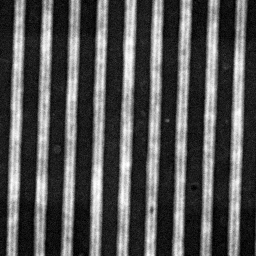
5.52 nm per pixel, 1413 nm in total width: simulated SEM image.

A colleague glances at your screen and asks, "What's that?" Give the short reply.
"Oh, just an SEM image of parallel lines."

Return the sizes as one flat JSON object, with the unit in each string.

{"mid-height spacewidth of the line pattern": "0.103 micrometres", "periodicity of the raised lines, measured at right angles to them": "0.153 microns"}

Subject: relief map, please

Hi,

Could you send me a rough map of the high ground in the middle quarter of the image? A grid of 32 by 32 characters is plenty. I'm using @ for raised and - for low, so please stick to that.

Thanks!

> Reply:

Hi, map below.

-@@-----@@-----@@-----@@-----@@-
-@@-----@@-----@@-----@@-----@@-
-@@-----@@-----@@-----@@-----@@-
-@@-----@@-----@@-----@@-----@@-
-@@-----@@-----@@-----@@-----@@-
-@@-----@@-----@@-----@@-----@@-
-@@-----@@-----@@-----@@-----@@-
-@@-----@@-----@@-----@@-----@@-
-@@-----@@-----@@-----@@-----@@-
-@@-----@@-----@@-----@@-----@@-
-@@-----@@-----@@-----@@-----@@-
-@@-----@@-----@@-----@@-----@@-
-@@-----@@-----@@-----@@-----@@-
-@@-----@@-----@@-----@@----@@@-
-@@-----@@-----@@-----@@----@@@-
-@@-----@@-----@@-----@@----@@@-
-@@-----@@-----@@-----@@----@@@-
-@@-----@@-----@@-----@@----@@--
-@@-----@@-----@@----@@@----@@--
-@@-----@@-----@@----@@@----@@--
-@@----@@@-----@-----@@@----@@--
-@@----@@@-----@@----@@@----@@--
-@@----@@@----@@@----@@-----@@--
-@@----@@@----@@@----@@-----@@--
-@@----@@-----@@@----@@-----@@--
@@-----@@-----@@-----@@-----@@--
@@-----@@-----@@-----@@-----@@--
@@-----@@-----@@-----@@-----@@--
@@-----@@-----@@-----@@-----@@--
@@-----@@-----@@-----@@-----@@--
@@-----@@-----@@-----@@-----@@--
@@-----@@-----@@-----@@-----@@--